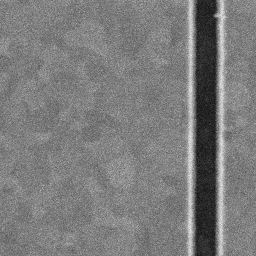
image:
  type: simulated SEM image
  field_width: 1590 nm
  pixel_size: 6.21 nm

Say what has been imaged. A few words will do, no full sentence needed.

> one or a few lines or trenches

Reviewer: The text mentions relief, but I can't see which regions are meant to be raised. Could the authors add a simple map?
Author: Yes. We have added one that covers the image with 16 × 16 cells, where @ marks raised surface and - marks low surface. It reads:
@@@@@@@@@@@@--@@
@@@@@@@@@@@@--@@
@@@@@@@@@@@@--@@
@@@@@@@@@@@@--@@
@@@@@@@@@@@@--@@
@@@@@@@@@@@@--@@
@@@@@@@@@@@@--@@
@@@@@@@@@@@@--@@
@@@@@@@@@@@@--@@
@@@@@@@@@@@@--@@
@@@@@@@@@@@@--@@
@@@@@@@@@@@@--@@
@@@@@@@@@@@@--@@
@@@@@@@@@@@@--@@
@@@@@@@@@@@@--@@
@@@@@@@@@@@@--@@